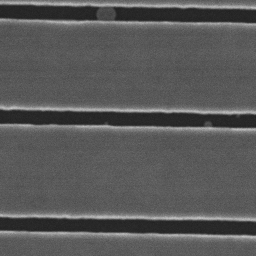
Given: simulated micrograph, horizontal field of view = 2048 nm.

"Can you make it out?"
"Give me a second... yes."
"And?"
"lines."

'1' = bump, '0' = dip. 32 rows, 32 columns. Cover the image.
11111111111111111111111111111111
00000000000000000000000000000000
11000000000000000000000000000000
11111111111111111111111111111111
11111111111111111111111111111111
11111111111111111111111111111111
11111111111111111111111111111111
11111111111111111111111111111111
11111111111111111111111111111111
11111111111111111111111111111111
11111111111111111111111111111111
11111111111111111111111111111111
11111111111111111111111111111111
11111111111111111111111111111111
00000000000000000000000000000000
00000000000000000000000000000000
11111111111111111111111111111111
11111111111111111111111111111111
11111111111111111111111111111111
11111111111111111111111111111111
11111111111111111111111111111111
11111111111111111111111111111111
11111111111111111111111111111111
11111111111111111111111111111111
11111111111111111111111111111111
11111111111111111111111111111111
11111111111111111111111111111111
00000000000000000000000000000111
00000000000000000000000000000000
11111111111111111111111111111110
11111111111111111111111111111111
11111111111111111111111111111111